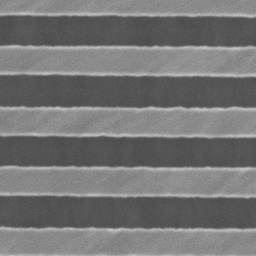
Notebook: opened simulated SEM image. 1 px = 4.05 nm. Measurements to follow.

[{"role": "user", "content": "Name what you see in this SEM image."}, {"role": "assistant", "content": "lines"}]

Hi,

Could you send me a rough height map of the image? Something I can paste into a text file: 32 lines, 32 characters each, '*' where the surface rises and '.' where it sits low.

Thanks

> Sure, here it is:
********************************
********************************
................................
................................
................................
................................
********************************
********************************
********************************
.................*.*.**...******
................................
................................
................................
********.******...**.**......*..
********************************
********************************
********************************
................................
................................
................................
................................
********************************
********************************
********************************
..............***.....**********
................................
................................
................................
*...............................
********************************
********************************
********************************